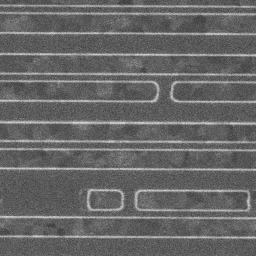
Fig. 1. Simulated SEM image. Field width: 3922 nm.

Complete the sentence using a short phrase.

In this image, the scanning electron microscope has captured parallel lines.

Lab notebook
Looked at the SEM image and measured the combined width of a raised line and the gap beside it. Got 520 nm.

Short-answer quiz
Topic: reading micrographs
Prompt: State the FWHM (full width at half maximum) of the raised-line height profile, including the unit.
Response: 20 px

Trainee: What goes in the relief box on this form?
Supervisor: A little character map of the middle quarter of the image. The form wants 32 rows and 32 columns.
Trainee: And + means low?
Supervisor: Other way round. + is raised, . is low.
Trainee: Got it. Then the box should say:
++++++++++++++++++++++++++++++++
++++++++++++++++++++++++++++++++
...................+++++++++++++
................................
+++++++++++++++++++++...........
+++++++++++++++++++++++....+++++
+++++++++++++++++++++++....+++++
+++++++++++++++++++++++....+++++
+++++++++++++++++++++++....+++++
................................
................................
................................
................................
................................
................................
++++++++++++++++++++++++++++++++
++++++++++++++++++++++++++++++++
++++++++++++++++++++++++++++++++
++++++++++++++++++++++++++++++++
................................
................................
+++++++++++++++++++++++++.......
++++++++++++++++++++++++++++++++
++++++++++++++++++++++++++++++++
++++++++++++++++++++++++++++++++
++++++++++++++++++++++++++++++++
................................
................................
................................
................................
................................
................................